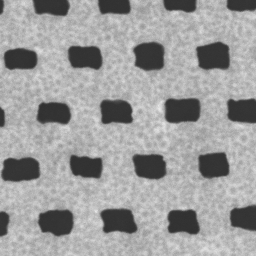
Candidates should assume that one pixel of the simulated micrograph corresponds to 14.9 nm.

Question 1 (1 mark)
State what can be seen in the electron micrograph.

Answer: a regular array of holes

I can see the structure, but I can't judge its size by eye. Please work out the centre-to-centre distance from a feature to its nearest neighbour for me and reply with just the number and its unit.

0.934 microns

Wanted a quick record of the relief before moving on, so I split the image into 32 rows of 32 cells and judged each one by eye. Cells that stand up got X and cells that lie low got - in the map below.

-XXX-----XXX----XXXX----XXXX----
XXXXX---XXXXX---XXXXXXX-XXXXXXXX
XXXXXXXXXXXXXXXXXXXXXXXXXXXXXXXX
XXXXXXXXXXXXXXXXXXXXXXXXXXXXXXXX
XXXXXXXXXXXXXXXXXXXXXXXXXXXXXXXX
XXXXXXXXXXXXXXXXXX--XXXXXX--XXXX
X---XXXXX----XXXX----XXXX----XXX
X----XXXX----XXXX---XXXXX----XXX
X---XXXXXXX--XXXX---XXXXX---XXXX
XXXXXXXXXXXXXXXXXXXXXXXXXXXXXXXX
XXXXXXXXXXXXXXXXXXXXXXXXXXXXXXXX
XXXXXXXXXXXXXXXXXXXXXXXXXXXXXXXX
XXXXXXXXXXXXXXXXXXXXX----XXXXX--
XXXXX----XXX-----XXXX----XXX----
-XXXX----XXXX----XXXX----XXX----
-XXXXXXXXXXXXXXXXXXXXXXXXXXXXXXX
XXXXXXXXXXXXXXXXXXXXXXXXXXXXXXXX
XXXXXXXXXXXXXXXXXXXXXXXXXXXXXXXX
XXXXXXXXXXXXXXXXXXXXXXXXXXXXXXXX
XXXXXXXXX-XXXXXXX---XXXXX---XXXX
-----XXXX----XXXX----XXXX----XXX
-----XXXX----XXXX----XXXX----XXX
X---XXXXXXXXXXXXXXXXXXXXXXXXXXXX
XXXXXXXXXXXXXXXXXXXXXXXXXXXXXXXX
XXXXXXXXXXXXXXXXXXXXXXXXXXXXXXXX
XXXXXXXXXXXXXXXXXXXXXXXXXXXXXXXX
-XXXX----XXXX---XXXXX---XXXXX---
-XXXX----XXXX----XXXX----XXXX---
-XXXX----XXXX----XXXX----XXXXX--
XXXXXXXXXXXXXXXXXXXXXXXXXXXXXXXX
XXXXXXXXXXXXXXXXXXXXXXXXXXXXXXXX
XXXXXXXXXXXXXXXXXXXXXXXXXXXXXXXX